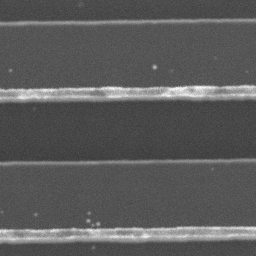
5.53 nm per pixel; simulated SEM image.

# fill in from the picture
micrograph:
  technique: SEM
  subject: lines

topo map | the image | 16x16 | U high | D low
DDDDDDDDDDDDDDDD
UUUUUUUUUUUUUUUU
UUUUUUUUUUUUUUUU
UUUUUUUUUUUUUUUU
UUUUUUUUUUUUUUUU
UUUUUUUUUUUUUUUU
DDDDDDDDDDDDDDDD
DDDDDDDDDDDDDDDD
DDDDDDDDDDDDDDDD
DDDDDDDDDDDDDDDD
UUUUUUUUUUUUUUUU
UUUUUUUUUUUUUUUU
UUUUUUUUUUUUUUUU
UUUUUUUUUUUUUUUU
UUUUUUUUUUUUUUUU
DDDDDDDDDDDDDDDD